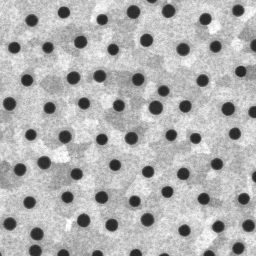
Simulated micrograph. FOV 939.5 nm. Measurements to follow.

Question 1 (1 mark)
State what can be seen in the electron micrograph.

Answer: a regular array of holes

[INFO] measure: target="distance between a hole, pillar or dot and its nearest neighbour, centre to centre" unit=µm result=0.106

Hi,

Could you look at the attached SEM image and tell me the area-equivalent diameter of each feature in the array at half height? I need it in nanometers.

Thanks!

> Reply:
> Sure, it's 44.8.